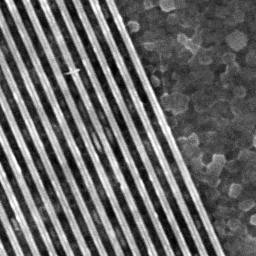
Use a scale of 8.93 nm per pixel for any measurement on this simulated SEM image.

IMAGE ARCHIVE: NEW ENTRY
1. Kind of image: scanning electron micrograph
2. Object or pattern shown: parallel lines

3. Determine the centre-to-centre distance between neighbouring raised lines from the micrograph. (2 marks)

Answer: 137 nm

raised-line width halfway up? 55.2 nm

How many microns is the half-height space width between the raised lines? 0.0859